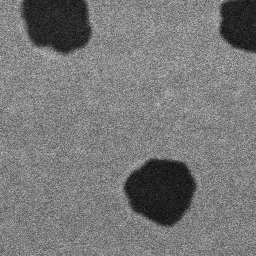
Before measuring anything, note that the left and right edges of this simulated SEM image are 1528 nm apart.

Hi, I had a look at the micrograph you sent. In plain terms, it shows holes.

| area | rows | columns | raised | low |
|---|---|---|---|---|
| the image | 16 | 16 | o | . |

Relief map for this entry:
o....ooooooooo..
oo....oooooooo..
oo....oooooooo..
oooooooooooooooo
oooooooooooooooo
oooooooooooooooo
oooooooooooooooo
oooooooooooooooo
oooooooooooooooo
oooooooooooooooo
ooooooooo...oooo
oooooooo....oooo
oooooooo....oooo
ooooooooo..ooooo
oooooooooooooooo
oooooooooooooooo